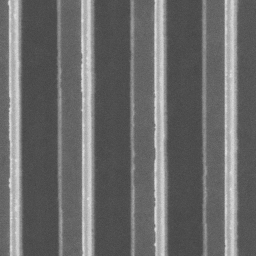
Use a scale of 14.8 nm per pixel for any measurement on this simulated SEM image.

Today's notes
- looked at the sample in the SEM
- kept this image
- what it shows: lines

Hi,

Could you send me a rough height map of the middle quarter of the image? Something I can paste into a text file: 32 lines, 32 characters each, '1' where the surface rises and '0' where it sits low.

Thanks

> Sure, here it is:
11111110000000000111111110000000
11111110000000000111111110000000
11111110000000000111111110000000
11111110000000000111111110000000
11111110000000000111111110000000
11111110000000000111111110000000
11111110000000000111111110000000
11111110000000000111111110000000
11111110000000000111111110000000
11111110000000000111111110000000
11111110000000000111111110000000
11111110000000000111111110000000
11111110000000000111111110000000
11111110000000000111111110000000
11111110000000000111111110000000
11111110000000000111111110000000
11111110000000000111111110000000
11111110000000000111111110000000
11111110000000000111111110000000
11111110000000000111111110000000
11111110000000000111111110000000
11111110000000000111111110000000
11111110000000000111111110000000
11111110000000000111111110000000
11111110000000000111111110000000
11111110000000000111111110000000
11111110000000000111111110000000
11111110000000000111111110000000
11111110000000000111111110000000
11111110000000000111111110000000
11111110000000000111111110000000
11111110000000000111111110000000